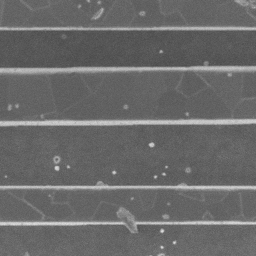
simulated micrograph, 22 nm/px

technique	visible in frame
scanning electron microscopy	lines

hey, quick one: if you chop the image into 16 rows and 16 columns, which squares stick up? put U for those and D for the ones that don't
UUUUUUUUUUUUUUUU
UUUUUUUUUUUUUUUU
DDDDDDDDDDDDDDDD
DDDDDDDDDDDDDDDD
UUUUUUUUUUUUUUUU
UUUUUUUUUUUUUUUU
UUUUUUUUUUUUUUUU
UUUUUUUUUUUUUUUU
DDDDDDDDDDDDDDDD
DDDDDDDDDDDDDDDD
DDDDDDDDDDDDDDDD
DDDDDDDDDDDDDDDD
UUUUUUUUUUUUUUUU
UUUUUUUUUUUUUUUU
DDDDDDDDDDDDDDDD
DDDDDDDDDDDDDDDD